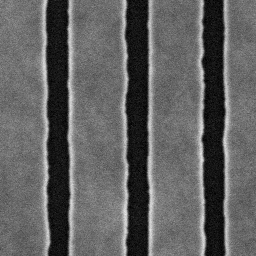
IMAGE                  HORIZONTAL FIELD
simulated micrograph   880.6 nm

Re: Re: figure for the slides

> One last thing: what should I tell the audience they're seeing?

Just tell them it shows lines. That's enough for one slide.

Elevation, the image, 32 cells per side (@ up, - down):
@@@@@@---@@@@@@@---@@@@@@---@@@@
@@@@@@---@@@@@@@---@@@@@@---@@@@
@@@@@@---@@@@@@@---@@@@@@---@@@@
@@@@@@---@@@@@@@---@@@@@@---@@@@
@@@@@@---@@@@@@@---@@@@@@---@@@@
@@@@@@---@@@@@@@---@@@@@@---@@@@
@@@@@@---@@@@@@@---@@@@@@---@@@@
@@@@@@---@@@@@@@---@@@@@@---@@@@
@@@@@@---@@@@@@@---@@@@@@---@@@@
@@@@@@---@@@@@@@---@@@@@@---@@@@
@@@@@@---@@@@@@@---@@@@@@@--@@@@
@@@@@@---@@@@@@@---@@@@@@---@@@@
@@@@@@---@@@@@@@---@@@@@@---@@@@
@@@@@@---@@@@@@@---@@@@@@---@@@@
@@@@@@---@@@@@@@---@@@@@@---@@@@
@@@@@@---@@@@@@@---@@@@@@---@@@@
@@@@@@---@@@@@@@---@@@@@@---@@@@
@@@@@@---@@@@@@@---@@@@@@---@@@@
@@@@@@---@@@@@@@---@@@@@@---@@@@
@@@@@@---@@@@@@@---@@@@@@---@@@@
@@@@@@---@@@@@@@---@@@@@@---@@@@
@@@@@@---@@@@@@@---@@@@@@---@@@@
@@@@@@---@@@@@@@---@@@@@@---@@@@
@@@@@@---@@@@@@@---@@@@@@---@@@@
@@@@@@---@@@@@@@---@@@@@@@--@@@@
@@@@@@---@@@@@@@---@@@@@@@--@@@@
@@@@@@---@@@@@@@---@@@@@@@--@@@@
@@@@@@---@@@@@@@---@@@@@@@--@@@@
@@@@@@---@@@@@@@---@@@@@@---@@@@
@@@@@@---@@@@@@@---@@@@@@@--@@@@
@@@@@@---@@@@@@@---@@@@@@@--@@@@
@@@@@@---@@@@@@@---@@@@@@@--@@@@